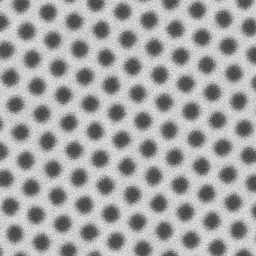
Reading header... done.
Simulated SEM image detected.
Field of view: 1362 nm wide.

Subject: a regular array of holes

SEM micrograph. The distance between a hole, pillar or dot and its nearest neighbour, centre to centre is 148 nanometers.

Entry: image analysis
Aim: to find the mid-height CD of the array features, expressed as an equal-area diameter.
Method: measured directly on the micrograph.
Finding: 101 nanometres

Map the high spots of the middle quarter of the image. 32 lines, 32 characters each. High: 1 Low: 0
01111111100011100001111001111011
01110001111111100001110000111111
11100000111111110001110000111111
11100000111001111111110000111000
11100001110000111111110001110000
01111011100000111000111111110000
00111111110000110000011111111000
00111111111001110000011100111111
00111000111111110000111000011111
01110000011111111000111000001110
11110000011100011111111000011100
11111000111000011111111100111000
10111111111000001100011111111000
00011111111000011100001111111100
00001110011100111000001110001111
00011100001111111100001100001111
00011000001111111110011100000111
11111000001110001111111100001110
11111100011100000111111110001110
11001111111100000111000111111110
00000111111110001110000111111111
00000111001111111110000111000111
00000110000111111110000111000011
10001110000111100111001110000011
11111110000111000011111111000011
11111111001110000011111111101111
11100111111111000011100011111111
11000011111111000111000001111111
10000011100011111111000001110001
11000011000001111111000011100001
11000111000001110011100111100001
11111111000011100001111111100001